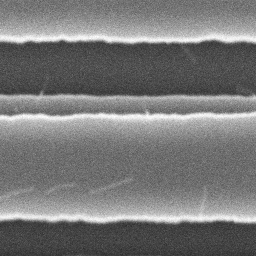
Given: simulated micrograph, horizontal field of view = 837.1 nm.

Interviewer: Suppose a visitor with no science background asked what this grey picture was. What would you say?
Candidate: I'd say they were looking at lines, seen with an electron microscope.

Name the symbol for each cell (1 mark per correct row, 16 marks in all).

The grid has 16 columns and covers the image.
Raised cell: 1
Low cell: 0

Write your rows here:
1111111111111111
1111111111111111
0110000111111011
0000000000000000
0000000000000000
0000000000000000
0000000000000000
1111111111111111
1111111111111111
1111111111111111
1111111111111111
1111111111111111
1111111111111111
1111111111111111
0000000000000000
0000000000000000